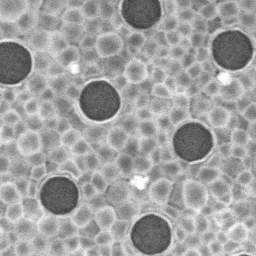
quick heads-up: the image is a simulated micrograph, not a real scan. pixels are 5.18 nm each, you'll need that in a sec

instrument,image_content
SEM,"holes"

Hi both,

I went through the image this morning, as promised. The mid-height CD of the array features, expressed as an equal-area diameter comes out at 214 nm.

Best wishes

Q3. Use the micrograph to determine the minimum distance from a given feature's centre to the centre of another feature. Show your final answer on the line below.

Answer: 521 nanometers